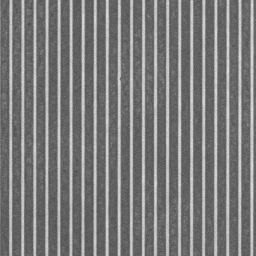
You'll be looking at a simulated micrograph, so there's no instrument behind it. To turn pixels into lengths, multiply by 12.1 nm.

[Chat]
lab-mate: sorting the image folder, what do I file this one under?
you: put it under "parallel lines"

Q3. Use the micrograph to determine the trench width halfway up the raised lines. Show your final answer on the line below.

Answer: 122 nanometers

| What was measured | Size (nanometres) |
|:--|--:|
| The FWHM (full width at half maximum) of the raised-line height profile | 30.1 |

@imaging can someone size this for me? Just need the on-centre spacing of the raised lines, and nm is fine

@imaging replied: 145